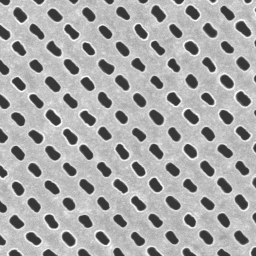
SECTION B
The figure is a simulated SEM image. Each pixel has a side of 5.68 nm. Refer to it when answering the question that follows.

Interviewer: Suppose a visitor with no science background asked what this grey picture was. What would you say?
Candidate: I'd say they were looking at a regular array of holes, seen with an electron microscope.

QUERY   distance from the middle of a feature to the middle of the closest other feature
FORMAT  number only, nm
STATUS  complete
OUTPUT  134